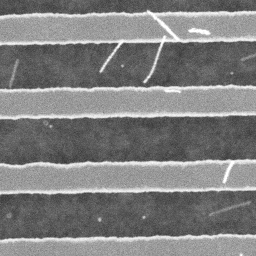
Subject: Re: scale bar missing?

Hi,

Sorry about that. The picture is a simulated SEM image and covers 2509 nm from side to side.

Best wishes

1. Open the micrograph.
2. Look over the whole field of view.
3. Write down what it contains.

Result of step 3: lines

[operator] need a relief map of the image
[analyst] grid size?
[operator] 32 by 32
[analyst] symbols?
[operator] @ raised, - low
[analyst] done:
--------------------------------
------------------@-----------@@
@@@@@@@@@@@@@@@@@@@@@@@@@@@@@@@@
@@@@@@@@@@@@@@@@@@@@@@@@@@@@@@@@
@@@@@@@@@@@@@@@@@@@@@@@@@@@@@@@@
--------------------------------
--------------------------------
--------------------------------
--------------------------------
--------------------------------
--------------------------------
@@@@@@@@@@@@@@@@@@@@@@@@@@@@@@@@
@@@@@@@@@@@@@@@@@@@@@@@@@@@@@@@@
@@@@@@@@@@@@@@@@@@@@@@@@@@@@@@@@
@@@@@@@@@@@@@@@@-@@-------------
--------------------------------
--------------------------------
--------------------------------
--------------------------------
--------------------------------
@--@@@@--@@@@@@@@@@@@@@@@@@@@@@@
@@@@@@@@@@@@@@@@@@@@@@@@@@@@@@@@
@@@@@@@@@@@@@@@@@@@@@@@@@@@@@@@@
@@@@@@@@@@@@@@@@@@@@@@@@@@@@@@@@
--------------------------------
--------------------------------
--------------------------------
--------------------------------
--------------------------------
-----------------------@-@-@@@@@
@@@@@@@@@@@@@@@@@@@@@@@@@@@@@@@@
@@@@@@@@@@@@@@@@@@@@@@@@@@@@@@@@